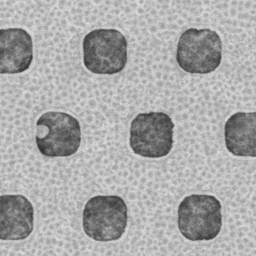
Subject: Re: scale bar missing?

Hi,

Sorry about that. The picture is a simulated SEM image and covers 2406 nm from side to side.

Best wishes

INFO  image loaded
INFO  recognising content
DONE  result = holes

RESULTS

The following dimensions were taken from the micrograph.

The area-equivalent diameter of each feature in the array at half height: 449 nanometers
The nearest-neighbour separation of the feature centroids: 0.887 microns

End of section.